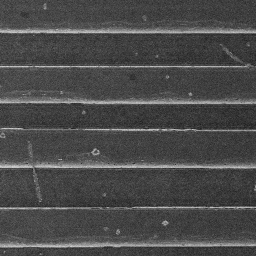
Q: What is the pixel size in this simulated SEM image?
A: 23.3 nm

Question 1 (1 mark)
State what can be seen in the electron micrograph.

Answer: lines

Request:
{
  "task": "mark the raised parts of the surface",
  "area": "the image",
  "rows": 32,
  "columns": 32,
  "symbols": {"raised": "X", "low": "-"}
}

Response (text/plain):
XXXXXXXXXXXXXXXXXXXXXXXXXXXXXXXX
XXXXXXXXXXXXXXXXXXXXXXXXXXXXXXXX
XXXXXXXXXXXXXXXXXXXXXXXXXXXXXXXX
XXXXXXXXXXXXXXXXXXXXXXXXXXXXXXXX
--------------------------------
--------------------------------
--------------------------------
--------------------------------
XXXXXXXXXXXXXXXXXXXXXXXXXXXXXXXX
XXXXXXXXXXXXXXXXXXXXXXXXXXXXXXXX
XXXXXXXXXXXXXXXXXXXXXXXXXXXXXXXX
XXXXXXXXXXXXXXXXXXXXXXXXXXXXXXXX
XXXXXXXXXXXXXXXXXXXXXXXXXXXXXXXX
--------------------------------
--------------------------------
--------------------------------
XXXXXXXXXXXXXXXXXXXXXXXXXXXXXXXX
XXXXXXXXXXXXXXXXXXXXXXXXXXXXXXXX
XXXXXXXXXXXXXXXXXXXXXXXXXXXXXXXX
XXXXXXXXXXXXXXXXXXXXXXXXXXXXXXXX
XXXXXXXXXXXXXXXXXXXXXXXXXXXXXXXX
--------------------------------
--------------------------------
--------------------------------
--------------------------------
--------------------------------
XXXXXXXXXXXXXXXXXXXXXXXXXXXXXXXX
XXXXXXXXXXXXXXXXXXXXXXXXXXXXXXXX
XXXXXXXXXXXXXXXXXXXXXXXXXXXXXXXX
XXXXXXXXXXXXXXXXXXXXXXXXXXXXXXXX
XXXXXXXXXXXXXXXXXXXXXXXXXXXXXXXX
--------------------------------